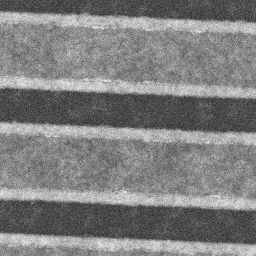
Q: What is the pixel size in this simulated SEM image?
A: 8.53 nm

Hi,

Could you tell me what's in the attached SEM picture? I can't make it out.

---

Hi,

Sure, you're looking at one or a few lines or trenches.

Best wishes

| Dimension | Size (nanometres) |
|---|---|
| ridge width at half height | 554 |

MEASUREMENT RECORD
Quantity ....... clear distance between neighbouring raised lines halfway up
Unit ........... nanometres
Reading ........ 391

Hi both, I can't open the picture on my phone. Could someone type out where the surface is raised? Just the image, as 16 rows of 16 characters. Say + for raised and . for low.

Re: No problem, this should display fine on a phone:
................
++++++++++......
++++++++++++++++
++++++++++++++++
++++++++++++++++
.........+++++++
................
................
+++++++++++.....
++++++++++++++++
++++++++++++++++
++++++++++++++++
.........+++++++
................
................
+++++++++++++...